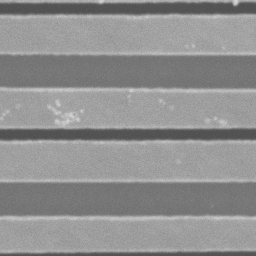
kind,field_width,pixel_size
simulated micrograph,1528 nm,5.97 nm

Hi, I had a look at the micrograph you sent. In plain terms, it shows lines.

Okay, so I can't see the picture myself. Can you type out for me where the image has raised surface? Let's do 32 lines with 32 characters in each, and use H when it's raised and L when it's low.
LLLLLLLLLLLLLLLLLLLLLLLLLLLLLHLL
LLLLLLLLLLLLLLLLLLLLLLLLLLLLLLLL
HHHHHHHHHHHHHHHHHHHHHHHHHHHHHHHH
HHHHHHHHHHHHHHHHHHHHHHHHHHHHHHHH
HHHHHHHHHHHHHHHHHHHHHHHHHHHHHHHH
HHHHHHHHHHHHHHHHHHHHHHHHHHHHHHHH
HHHHHHHHHHHHHHHHHHHHHHHHHHHHHHHH
LLLLLLLLLLLLLLLLLLLLLLLLLLLLLLLL
LLLLLLLLLLLLLLLLLLLLLLLLLLLLLLLL
LLLLLLLLLLLLLLLLLLLLLLLLLLLLLLLL
LLLLLLLLLLLLLLLLLLLLLLLLLLLLLLLL
HHHHHHHHHHHHHHHHHHHHHHHHHHHHHHHH
HHHHHHHHHHHHHHHHHHHHHHHHHHHHHHHH
HHHHHHHHHHHHHHHHHHHHHHHHHHHHHHHH
HHHHHHHHHHHHHHHHHHHHHHHHHHHHHHHH
HHHHHHHHHHHHHHHHHHHHHHHHHHHHHHHH
LLLLLLLLLLLLLLLLLLLLLLLLLLLLLLLL
LLLHLHLLLHLLLLLLLLLLLLLHLLLLLHLL
HHHHHHHHHHHHHHHHHHHHHHHHHHHHHHHH
HHHHHHHHHHHHHHHHHHHHHHHHHHHHHHHH
HHHHHHHHHHHHHHHHHHHHHHHHHHHHHHHH
HHHHHHHHHHHHHHHHHHHHHHHHHHHHHHHH
HHHHHHHHHHHHHHHHHHHHHHHHHHHHHHHH
LLLLLLLLLLLLLLLLLLLLLLLLLLLLLLLL
LLLLLLLLLLLLLLLLLLLLLLLLLLLLLLLL
LLLLLLLLLLLLLLLLLLLLLLLLLLLLLLLL
LLLLLLLLLLLLLLLLLLLLLLLLLLLLLLLL
HHHHHHHHHHHHHHHHHHHHHHHHHHHHHHHH
HHHHHHHHHHHHHHHHHHHHHHHHHHHHHHHH
HHHHHHHHHHHHHHHHHHHHHHHHHHHHHHHH
HHHHHHHHHHHHHHHHHHHHHHHHHHHHHHHH
HHHHHHHHHHHLLLLLLLLLLLLLLLLLLLLL